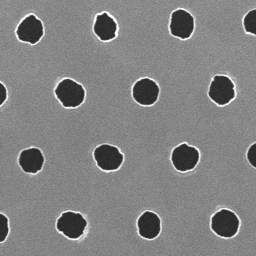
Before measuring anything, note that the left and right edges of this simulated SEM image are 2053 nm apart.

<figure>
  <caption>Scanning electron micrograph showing a regular array of holes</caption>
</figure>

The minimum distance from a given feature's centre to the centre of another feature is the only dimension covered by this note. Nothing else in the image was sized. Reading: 607 nm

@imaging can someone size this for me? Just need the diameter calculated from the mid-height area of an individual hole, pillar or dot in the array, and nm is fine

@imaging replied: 217